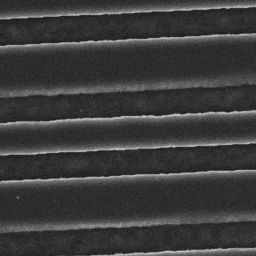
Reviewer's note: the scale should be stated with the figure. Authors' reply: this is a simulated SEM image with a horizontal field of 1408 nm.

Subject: lines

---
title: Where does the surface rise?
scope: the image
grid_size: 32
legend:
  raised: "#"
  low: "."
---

################################
##################..............
................................
................................
..........................######
.....###########################
################################
################################
################################
################################
############################....
###########.....................
................................
................................
.................###############
################################
################################
################################
##################..............
................................
................................
..........................######
....#.##########################
################################
################################
################################
################################
###########################.....
#########.......................
................................
................................
....................############